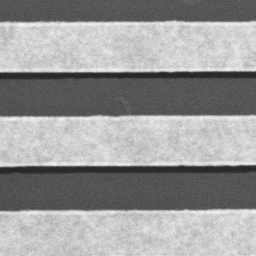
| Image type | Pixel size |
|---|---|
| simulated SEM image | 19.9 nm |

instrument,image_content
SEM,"lines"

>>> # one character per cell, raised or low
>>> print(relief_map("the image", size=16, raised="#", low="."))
................
################
################
################
................
................
................
################
################
################
................
................
................
################
################
################